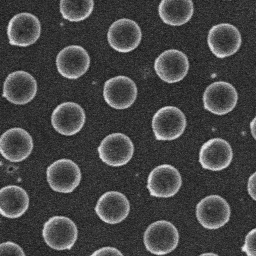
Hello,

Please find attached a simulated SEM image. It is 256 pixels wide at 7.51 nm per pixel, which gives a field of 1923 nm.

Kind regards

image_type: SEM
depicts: a regular array of raised bodies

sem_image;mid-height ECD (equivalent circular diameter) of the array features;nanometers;252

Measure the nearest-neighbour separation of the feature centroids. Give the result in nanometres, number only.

427